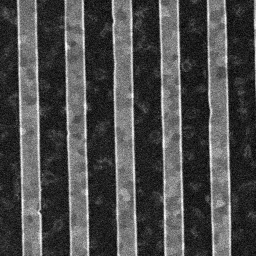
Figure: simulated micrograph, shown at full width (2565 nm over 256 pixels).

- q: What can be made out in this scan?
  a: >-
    parallel lines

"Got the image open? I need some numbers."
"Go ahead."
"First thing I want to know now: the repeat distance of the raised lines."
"0.475 micrometres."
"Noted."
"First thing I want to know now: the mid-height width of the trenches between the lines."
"0.291 micrometres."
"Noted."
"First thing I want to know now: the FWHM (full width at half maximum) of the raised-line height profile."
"179 nanometers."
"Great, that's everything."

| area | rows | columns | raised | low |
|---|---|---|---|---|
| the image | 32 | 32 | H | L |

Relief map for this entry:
LLHHLLLLHHLLLLHHLLLLHHLLLLHHLLLL
LLHHLLLLHHLLLLHHLLLLHHLLLLHHLLLL
LLHHLLLLHHLLLLHHLLLLHHLLLLHHLLLL
LLHHHLLLHHLLLLHHLLLLHHLLLLHHLLLL
LLHHHLLLHHLLLLHHLLLLHHLLLLHHLLLL
LLHHHLLLHHLLLLHHLLLLHHLLLLHHLLLL
LLHHHLLLHHLLLLHHLLLLHHLLLLHHLLLL
LLHHHLLLHHLLLLHHHLLLHHLLLLHHLLLL
LLHHHLLLHHHLLLHHLLLLHHLLLLHHLLLL
LLHHHLLLHHHLLLHHLLLLHHLLLLHHLLLL
LLHHHLLLHHHLLLHHHLLLHHLLLLHHLLLL
LLHHHLLLHHHLLLHHHLLLHHLLLLHHLLLL
LLHHHLLLHHHLLLHHHLLLHHLLLLHHLLLL
LLHHHLLLHHHLLLHHHLLLHHLLLLHHLLLL
LLLHHLLLHHHLLLHHHLLLHHHLLLHHLLLL
LLLHHLLLHHHLLLHHHLLLHHHLLLHHLLLL
LLLHHLLLLHHLLLHHHLLLHHHLLLHHHLLL
LLLHHLLLHHHLLLHHHLLLHHHLLLHHLLLL
LLLHHLLLLHHLLLLHHLLLHHHLLLHHHLLL
LLLHHLLLLHHLLLLHHLLLHHHLLLHHHLLL
LLLHHLLLLHHLLLLHHLLLLHHLLLHHHLLL
LLLHHLLLLHHLLLLHHLLLLHHLLLHHHLLL
LLLHHLLLLHHLLLLHHLLLLHHLLLHHHLLL
LLLHHLLLLHHLLLLHHLLLLHHLLLHHHLLL
LLLHHLLLLHHLLLLHHLLLLHHLLLHHHLLL
LLLHHLLLLHHLLLLHHLLLLHHLLLHHHLLL
LLLHHLLLLHHLLLLHHLLLLHHLLLHHHLLL
LLLHHLLLLHHLLLLHHLLLLHHLLLLHHLLL
LLLHHLLLLHHLLLLHHLLLLHHLLLLHHLLL
LLLHHLLLLHHLLLLHHLLLLHHLLLLHHLLL
LLLHHLLLLHHLLLLHHLLLLHHLLLLHHLLL
LLLHHLLLLHHLLLLHHLLLLHHLLLLHHLLL